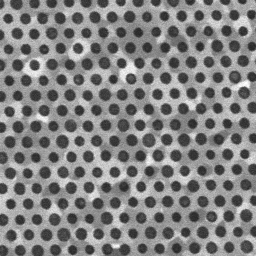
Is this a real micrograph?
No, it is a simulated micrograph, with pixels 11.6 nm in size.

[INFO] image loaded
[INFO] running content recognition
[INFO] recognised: a regular array of holes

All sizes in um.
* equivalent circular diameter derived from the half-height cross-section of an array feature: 0.132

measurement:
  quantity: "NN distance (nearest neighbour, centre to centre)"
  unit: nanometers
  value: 197